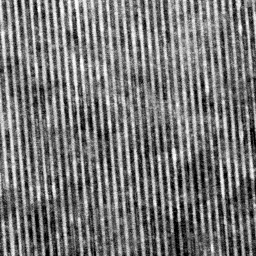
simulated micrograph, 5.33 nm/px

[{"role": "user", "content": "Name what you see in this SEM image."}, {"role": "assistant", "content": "parallel lines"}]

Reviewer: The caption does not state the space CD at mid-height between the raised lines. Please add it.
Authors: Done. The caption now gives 29.9 nm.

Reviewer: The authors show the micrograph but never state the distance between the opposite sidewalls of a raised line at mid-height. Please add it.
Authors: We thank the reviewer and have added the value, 10 nm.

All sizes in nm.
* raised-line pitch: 40.8